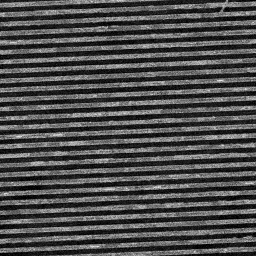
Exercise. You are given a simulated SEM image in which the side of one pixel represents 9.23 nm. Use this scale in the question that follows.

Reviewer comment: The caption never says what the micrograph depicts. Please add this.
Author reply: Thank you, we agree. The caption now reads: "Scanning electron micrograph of parallel lines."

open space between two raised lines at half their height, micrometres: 0.0484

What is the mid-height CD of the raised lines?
40.3 nanometres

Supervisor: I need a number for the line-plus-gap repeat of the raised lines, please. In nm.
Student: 87